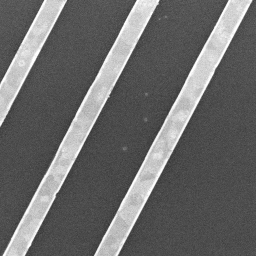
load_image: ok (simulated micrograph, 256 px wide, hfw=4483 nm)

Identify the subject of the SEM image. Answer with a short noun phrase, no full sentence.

one or a few lines or trenches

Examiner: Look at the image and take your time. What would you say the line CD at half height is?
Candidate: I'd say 335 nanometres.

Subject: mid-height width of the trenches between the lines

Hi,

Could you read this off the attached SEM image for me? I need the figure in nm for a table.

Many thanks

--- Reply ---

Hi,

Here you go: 1110